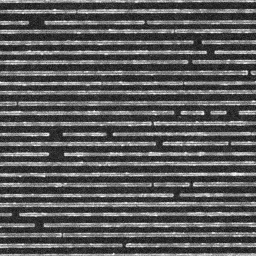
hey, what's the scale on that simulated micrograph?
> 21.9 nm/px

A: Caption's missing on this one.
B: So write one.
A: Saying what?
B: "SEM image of parallel lines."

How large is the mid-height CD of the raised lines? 3 pixels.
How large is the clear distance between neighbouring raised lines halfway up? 160 nm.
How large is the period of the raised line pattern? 223 nm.